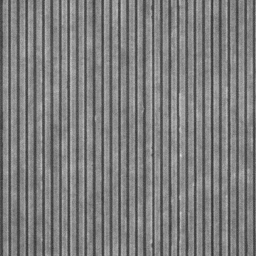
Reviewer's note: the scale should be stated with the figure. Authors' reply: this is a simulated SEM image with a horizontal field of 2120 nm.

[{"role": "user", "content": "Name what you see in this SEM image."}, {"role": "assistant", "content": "parallel lines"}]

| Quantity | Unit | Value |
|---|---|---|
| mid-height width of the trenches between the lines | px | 3.5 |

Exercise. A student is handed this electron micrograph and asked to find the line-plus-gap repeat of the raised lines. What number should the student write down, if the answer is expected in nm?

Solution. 69.8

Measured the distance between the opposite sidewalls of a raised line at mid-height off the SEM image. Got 43.5 nanometres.